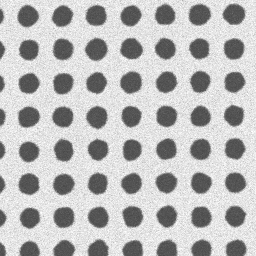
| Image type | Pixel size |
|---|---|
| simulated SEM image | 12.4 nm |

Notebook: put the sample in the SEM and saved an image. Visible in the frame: a regular array of holes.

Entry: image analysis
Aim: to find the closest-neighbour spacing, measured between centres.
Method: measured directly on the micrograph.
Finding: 0.416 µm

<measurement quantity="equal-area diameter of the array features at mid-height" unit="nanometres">263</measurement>